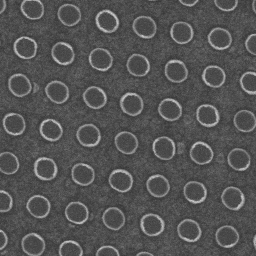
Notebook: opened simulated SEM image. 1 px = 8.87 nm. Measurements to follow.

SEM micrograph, a regular array of raised bodies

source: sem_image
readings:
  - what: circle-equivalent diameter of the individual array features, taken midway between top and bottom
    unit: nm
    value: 196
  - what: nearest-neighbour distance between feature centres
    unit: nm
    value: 336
